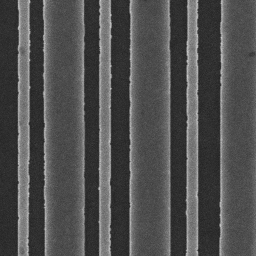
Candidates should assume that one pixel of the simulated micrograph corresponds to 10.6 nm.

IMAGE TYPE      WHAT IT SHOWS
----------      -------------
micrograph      lines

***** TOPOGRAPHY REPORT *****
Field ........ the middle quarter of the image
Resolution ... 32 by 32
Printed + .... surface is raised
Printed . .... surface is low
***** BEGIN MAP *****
+++++....+++.....+++++++++.....+
+++++....+++.....+++++++++.....+
+++++....+++.....+++++++++.....+
+++++....+++.....+++++++++.....+
+++++....+++.....+++++++++.....+
+++++....+++.....+++++++++.....+
+++++....+++.....+++++++++.....+
+++++....+++.....+++++++++.....+
+++++....+++.....+++++++++.....+
+++++....+++.....+++++++++.....+
+++++....+++.....+++++++++.....+
+++++....+++.....+++++++++.....+
+++++....+++.....+++++++++.....+
+++++....+++.....+++++++++.....+
+++++....+++.....+++++++++.....+
+++++....+++.....+++++++++.....+
+++++....+++.....+++++++++.....+
+++++....+++.....+++++++++.....+
+++++....+++.....+++++++++.....+
+++++....+++.....+++++++++.....+
+++++....+++.....+++++++++.....+
+++++....+++.....+++++++++.....+
+++++....+++.....+++++++++.....+
+++++....+++.....+++++++++.....+
+++++....+++.....+++++++++.....+
+++++....+++.....+++++++++.....+
+++++....+++.....+++++++++.....+
+++++....+++.....+++++++++.....+
+++++....+++.....+++++++++.....+
+++++....++......+++++++++.....+
+++++....+++.....+++++++++.....+
+++++....+++.....+++++++++.....+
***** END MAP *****